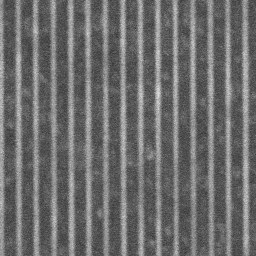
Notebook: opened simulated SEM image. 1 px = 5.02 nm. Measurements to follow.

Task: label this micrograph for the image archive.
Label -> parallel lines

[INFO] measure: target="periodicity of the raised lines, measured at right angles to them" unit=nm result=87.8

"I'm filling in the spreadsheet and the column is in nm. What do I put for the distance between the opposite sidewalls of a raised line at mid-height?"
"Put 18.2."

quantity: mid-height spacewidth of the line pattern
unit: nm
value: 67.1